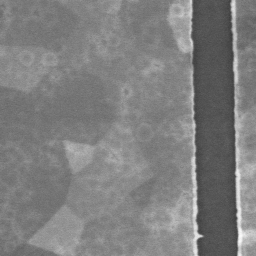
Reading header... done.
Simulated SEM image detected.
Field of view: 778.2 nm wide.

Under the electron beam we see one or a few lines or trenches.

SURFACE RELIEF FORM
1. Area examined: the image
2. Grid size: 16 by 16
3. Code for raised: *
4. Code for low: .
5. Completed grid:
************..**
************..**
************...*
************...*
************...*
************...*
************...*
************...*
************...*
************...*
************...*
************...*
************...*
************...*
************...*
************...*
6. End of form